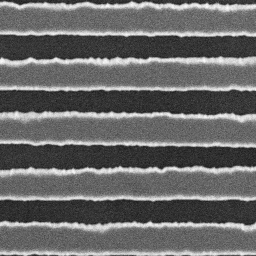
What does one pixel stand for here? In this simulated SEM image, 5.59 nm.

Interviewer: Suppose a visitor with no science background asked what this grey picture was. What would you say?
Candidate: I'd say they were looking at lines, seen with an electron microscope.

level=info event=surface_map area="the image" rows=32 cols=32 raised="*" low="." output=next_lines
**.***....**....***.............
********************************
********************************
********************************
................................
................................
................................
*..*****************************
********************************
********************************
********************************
................................
................................
................................
******************************.*
********************************
********************************
********************************
................................
................................
................................
********************************
********************************
********************************
********************************
................................
................................
................................
********************************
********************************
********************************
********************************